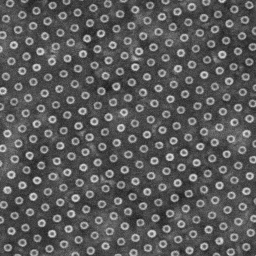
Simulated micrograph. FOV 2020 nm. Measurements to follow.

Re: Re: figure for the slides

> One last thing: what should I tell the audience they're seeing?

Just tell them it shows a regular array of raised bodies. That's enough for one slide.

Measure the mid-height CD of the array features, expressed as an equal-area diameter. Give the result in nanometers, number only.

54.9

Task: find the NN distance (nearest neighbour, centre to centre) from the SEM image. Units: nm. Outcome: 119